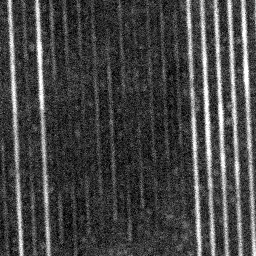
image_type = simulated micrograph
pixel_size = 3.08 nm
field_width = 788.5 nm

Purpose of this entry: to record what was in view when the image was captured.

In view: parallel lines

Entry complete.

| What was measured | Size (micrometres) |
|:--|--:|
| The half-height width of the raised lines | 0.0085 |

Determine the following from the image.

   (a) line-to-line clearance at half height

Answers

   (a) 11.1 px